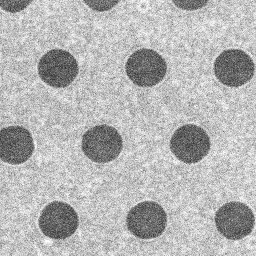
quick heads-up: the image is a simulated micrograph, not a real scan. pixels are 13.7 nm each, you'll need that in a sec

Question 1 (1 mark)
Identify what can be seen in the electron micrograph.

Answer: a regular array of holes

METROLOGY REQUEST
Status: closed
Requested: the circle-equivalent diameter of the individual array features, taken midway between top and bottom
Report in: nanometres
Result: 565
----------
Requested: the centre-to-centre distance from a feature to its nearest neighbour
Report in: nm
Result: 1200